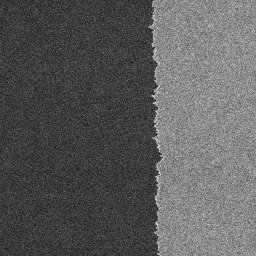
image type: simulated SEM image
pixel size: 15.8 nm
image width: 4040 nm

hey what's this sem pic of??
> one or a few lines or trenches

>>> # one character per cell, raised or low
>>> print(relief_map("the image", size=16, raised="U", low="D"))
DDDDDDDDDDUUUUUU
DDDDDDDDDDUUUUUU
DDDDDDDDDDUUUUUU
DDDDDDDDDDUUUUUU
DDDDDDDDDDUUUUUU
DDDDDDDDDDUUUUUU
DDDDDDDDDDUUUUUU
DDDDDDDDDDUUUUUU
DDDDDDDDDDUUUUUU
DDDDDDDDDDUUUUUU
DDDDDDDDDDUUUUUU
DDDDDDDDDDUUUUUU
DDDDDDDDDDUUUUUU
DDDDDDDDDDUUUUUU
DDDDDDDDDDUUUUUU
DDDDDDDDDDUUUUUU